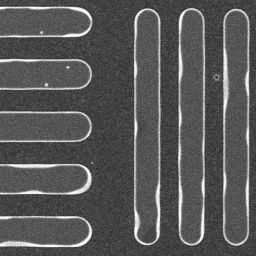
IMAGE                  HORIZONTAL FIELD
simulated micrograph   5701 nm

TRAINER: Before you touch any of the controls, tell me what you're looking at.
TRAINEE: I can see groups of lines, slits or small figures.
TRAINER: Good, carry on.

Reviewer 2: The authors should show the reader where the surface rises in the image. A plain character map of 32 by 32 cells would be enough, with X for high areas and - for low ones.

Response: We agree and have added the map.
--------------------------------
XXXXXXXXXXX-------X----XX----X--
XXXXXXXXXXX------XXX---XX---XXX-
XXXXXXXXXXX------XXX--XXXX--XXX-
XXXXXX-X---------XXX--XXXX--XXX-
-----------------XXX--XXXX--XXX-
-----------------XXX--XXXX--XXX-
-----------------XXX---XXX--XXX-
XXXXXXXXXXX------XXX---XXX--XXX-
XXXXXXXXXXX------XXX--XXXX--XXX-
XXXXXXXXXXX------XXX--XXXX--XXX-
-----------------XXX--XXXX--XXX-
-----------------XXX--XXXX--XXX-
-----------------XXX--XXXX--XXX-
XXXXXXXXXXX------XXX--XXXX--XXX-
XXXXXXXXXXX------XXX--XXXX--XXX-
XXXXXXXXXXX------XXX--XXXX--XXX-
XXXXXXXXXX-------XXX--XXXX--XXX-
-----------------XXX--XXX---XXX-
-----------------XXX--XXX---XXX-
-----------------XXX--XXXX--XXX-
XXXXXXXXXXX------XXX--XXXX--XXX-
XXXXXXXXXXX------XXX--XXXX--XXX-
XXXXXXXXXXX------XXX--XXX---XXX-
-----------------XXX---XXX--XXX-
-----------------XXX--XXXX--XXX-
-----------------XXX--XXX---XXX-
XXXXXXXXXXX------XXX--XXX---XXX-
XXXXXXXXXXX------XXX--XXX---XXX-
XXXXXXXXXXX------XXX---XX---XXX-
X--XXXXXXX-------------X-----X--
--------------------------------